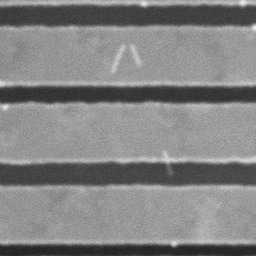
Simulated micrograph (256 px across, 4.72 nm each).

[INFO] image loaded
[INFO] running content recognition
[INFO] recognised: lines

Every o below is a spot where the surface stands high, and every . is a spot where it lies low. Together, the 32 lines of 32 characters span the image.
oooooooooooooooooooooooooooooooo
................................
................................
oooooooooooooooooooooooooooooooo
oooooooooooooooooooooooooooooooo
oooooooooooooooooooooooooooooooo
oooooooooooooooooooooooooooooooo
oooooooooooooooooooooooooooooooo
oooooooooooooooooooooooooooooooo
oooooooooooooooooooooooooooooooo
oooooooooooooooooooooooooooooooo
................................
................................
oooooooooooooooooooooooooooooooo
oooooooooooooooooooooooooooooooo
oooooooooooooooooooooooooooooooo
oooooooooooooooooooooooooooooooo
oooooooooooooooooooooooooooooooo
oooooooooooooooooooooooooooooooo
oooooooooooooooooooooooooooooooo
................................
................................
................................
oooooooooooooooooooooooooooooooo
oooooooooooooooooooooooooooooooo
oooooooooooooooooooooooooooooooo
oooooooooooooooooooooooooooooooo
oooooooooooooooooooooooooooooooo
oooooooooooooooooooooooooooooooo
oooooooooooooooooooooooooooooooo
o....................o.......o..
................................